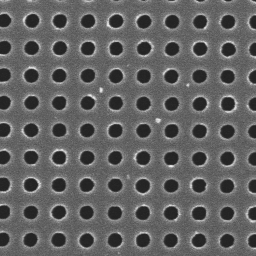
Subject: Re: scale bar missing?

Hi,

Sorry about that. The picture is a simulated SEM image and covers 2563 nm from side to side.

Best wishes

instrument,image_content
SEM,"a regular array of holes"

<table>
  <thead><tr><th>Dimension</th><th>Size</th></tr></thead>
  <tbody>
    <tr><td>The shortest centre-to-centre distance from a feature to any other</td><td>27.1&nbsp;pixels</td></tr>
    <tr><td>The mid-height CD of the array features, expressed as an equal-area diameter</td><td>144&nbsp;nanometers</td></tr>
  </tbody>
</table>